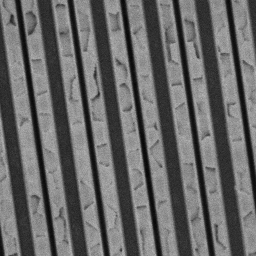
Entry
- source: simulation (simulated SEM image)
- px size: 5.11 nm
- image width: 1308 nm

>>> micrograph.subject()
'parallel lines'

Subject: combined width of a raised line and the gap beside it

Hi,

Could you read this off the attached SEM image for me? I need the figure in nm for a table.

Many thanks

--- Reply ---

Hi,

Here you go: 132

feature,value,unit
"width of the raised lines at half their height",0.0853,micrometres